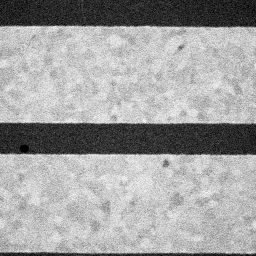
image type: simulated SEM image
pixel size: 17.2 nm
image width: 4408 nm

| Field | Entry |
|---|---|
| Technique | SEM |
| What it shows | one or a few lines or trenches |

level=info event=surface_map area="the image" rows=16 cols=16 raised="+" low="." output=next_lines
................
................
++++++++++++++++
++++++++++++++++
++++++++++++++++
++++++++++++++++
++++++++++++++++
++++++++++++++++
................
................
++++++++++++++++
++++++++++++++++
++++++++++++++++
++++++++++++++++
++++++++++++++++
++++++++++++++++